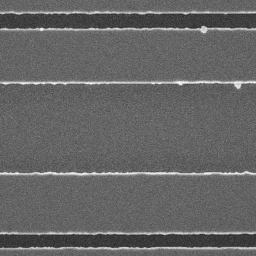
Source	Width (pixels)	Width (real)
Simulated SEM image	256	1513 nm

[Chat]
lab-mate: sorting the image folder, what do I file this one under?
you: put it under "lines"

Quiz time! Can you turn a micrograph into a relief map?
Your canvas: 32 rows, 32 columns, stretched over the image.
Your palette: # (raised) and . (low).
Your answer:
################################
################################
................................
.........................#......
################################
################################
################################
################################
################################
################################
................................
................................
................................
................................
................................
................................
................................
................................
................................
................................
................................
................................
################################
################################
################################
################################
################################
################################
################################
................................
................................
################################